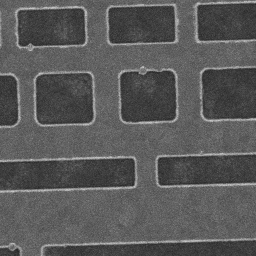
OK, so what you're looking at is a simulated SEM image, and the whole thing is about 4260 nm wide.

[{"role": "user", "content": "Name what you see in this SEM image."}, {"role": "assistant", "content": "one or a few lines or trenches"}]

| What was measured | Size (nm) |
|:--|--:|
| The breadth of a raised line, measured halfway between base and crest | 586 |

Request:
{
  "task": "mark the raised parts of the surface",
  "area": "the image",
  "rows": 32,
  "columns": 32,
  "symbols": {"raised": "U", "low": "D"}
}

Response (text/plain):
UUUUUUUUUUUUUUUUUUUUUUUUUDDDDDDD
UUDDDDDDDDDUUDDDDDDDDDUUUDDDDDDD
UUDDDDDDDDDUUDDDDDDDDDUUUDDDDDDD
UUDDDDDDDDDUUUDDDDDDDDUUUDDDDDDD
UUDDDDDDDDDUUDDDDDDDDDUUUDDDDDDD
UUDDDDDDDDUUUUDDDUUUUUUUUUUUUUUU
UUUUUUUUUUUUUUUUUUUUUUUUUUUUUUUU
UUUUUUUUUUUUUUUUUUUUUUUUUUUUUUUU
UUUUUUUUUUUUUUUUUUUUUUUUUUUDDDDD
DDUUUDDDDDDUUUUDDDDDDDUUUDDDDDDD
DDUUDDDDDDDDUUUDDDDDDDUUUDDDDDDD
DDUUDDDDDDDDUUUDDDDDDDUUUDDDDDDD
DDUUDDDDDDDDUUUDDDDDDDUUUDDDDDDD
DDUUDDDDDDDDUUUDDDDDDDUUUDDDDDDD
DDUUDDDDDDDDUUUDDDDDDDUUUDDDDDDD
DDUUUDDDDDDUUUUUUUUUUUUUUUUUUUUU
UUUUUUUUUUUUUUUUUUUUUUUUUUUUUUUU
UUUUUUUUUUUUUUUUUUUUUUUUUUUUUUUU
UUUUUUUUUUUUUUUUUUUUUUUUUUUUUUUU
UUUUUUUUUUUUUUUUUUUUUDDDDDDDDDDD
DDDDDDDDDDDDDDDDDUUUDDDDDDDDDDDD
DDDDDDDDDDDDDDDDDUUUDDDDDDDDDDDD
DDDDDDDDDDDDDDDDDUUUDDDDDDDDDDDD
DDDDDDDDDDDDDDUUUUUUUUUUUUUUUUUU
UUUUUUUUUUUUUUUUUUUUUUUUUUUUUUUU
UUUUUUUUUUUUUUUUUUUUUUUUUUUUUUUU
UUUUUUUUUUUUUUUUUUUUUUUUUUUUUUUU
UUUUUUUUUUUUUUUUUUUUUUUUUUUUUUUU
UUUUUUUUUUUUUUUUUUUUUUUUUUUUUUUU
UUUUUUUUUUUUUUUUUUUUUUUUUUUUUUUU
UUUUUUUUUDDUUDDDDDDDDDDDDDDDDDDD
DDDUUDDDDDDDDDDDDDDDDDDDDDDDDDDD